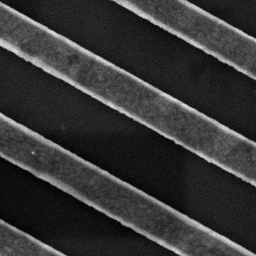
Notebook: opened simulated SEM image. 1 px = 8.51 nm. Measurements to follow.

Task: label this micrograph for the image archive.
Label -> lines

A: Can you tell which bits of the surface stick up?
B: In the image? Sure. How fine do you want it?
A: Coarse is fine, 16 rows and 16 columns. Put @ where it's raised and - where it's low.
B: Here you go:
@-------@@@@----
@@--------@@@@--
@@@@--------@@@@
-@@@@@-------@@@
---@@@@@-------@
-----@@@@@------
-------@@@@@----
@-------@@@@@---
@@@-------@@@@@-
@@@@--------@@@@
-@@@@@--------@@
---@@@@@--------
-----@@@@@------
-------@@@@@----
@--------@@@@---
@@@-------@@@@@-